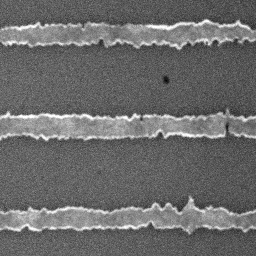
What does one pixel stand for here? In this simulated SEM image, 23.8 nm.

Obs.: one or a few lines or trenches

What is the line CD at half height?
431 nm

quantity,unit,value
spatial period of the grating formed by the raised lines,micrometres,2.2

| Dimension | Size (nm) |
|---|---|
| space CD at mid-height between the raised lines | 1740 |